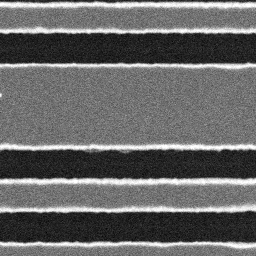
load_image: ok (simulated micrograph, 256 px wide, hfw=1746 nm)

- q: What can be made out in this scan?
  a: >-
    lines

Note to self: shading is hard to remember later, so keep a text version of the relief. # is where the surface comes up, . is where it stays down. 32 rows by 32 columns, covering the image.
################################
################################
################################
################################
................................
................................
................................
................................
################################
################################
################################
################################
################################
################################
################################
################################
################################
################################
################################
................................
................................
................................
################################
################################
################################
################################
##..##.##...####........#.......
................................
................................
................................
####################.########...
################################